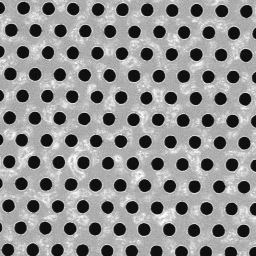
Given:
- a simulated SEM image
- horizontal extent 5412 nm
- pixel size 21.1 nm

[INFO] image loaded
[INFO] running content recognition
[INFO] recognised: a regular array of holes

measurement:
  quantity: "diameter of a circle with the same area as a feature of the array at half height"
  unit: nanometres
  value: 271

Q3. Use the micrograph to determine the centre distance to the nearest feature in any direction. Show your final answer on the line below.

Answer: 0.52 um